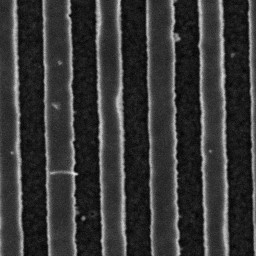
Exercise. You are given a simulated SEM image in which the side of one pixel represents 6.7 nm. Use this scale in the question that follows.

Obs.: lines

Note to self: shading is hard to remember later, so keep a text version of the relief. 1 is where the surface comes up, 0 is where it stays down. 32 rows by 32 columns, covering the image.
11000111100011100011110001110001
11000111100011100011110001110001
11000011100011100011110001110001
11000111100011100011110001110001
11000011100011100011110001110001
11000011100011100011110001110001
11000011100011100011110001110001
11000011100011100011110001110001
11000011100011100011110001110001
11000011100011100011110001110001
11000011100011100011110001110001
11000011100011100011110001110001
11000011100011100001110001110001
11000011100011100001110001110001
11000011100011100001110001110001
11000011100011100001110001110001
11000011100011100001110001110001
11000011100011100001110001110001
11000011100001100001110001110001
11100011100011100001110001110000
11100011100001100001110001110000
11100011100001100001110001110000
11100011100001100001110001110000
11100011100001100001110001110000
11100011100001100001110001110000
11100011100001100001110001110000
11100011100001100001110001110000
11100011100001100001110001110000
11100011100001110001110001110000
11100011100001110001110000110000
11100011100001110001110000110000
11100011110001110001111000110000